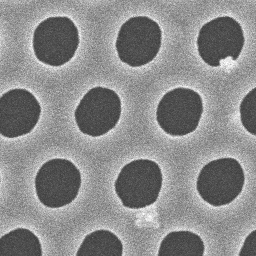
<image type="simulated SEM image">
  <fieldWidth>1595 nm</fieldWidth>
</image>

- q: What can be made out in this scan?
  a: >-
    a regular array of holes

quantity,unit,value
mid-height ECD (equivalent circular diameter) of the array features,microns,0.302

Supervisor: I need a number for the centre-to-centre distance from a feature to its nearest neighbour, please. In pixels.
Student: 81.3